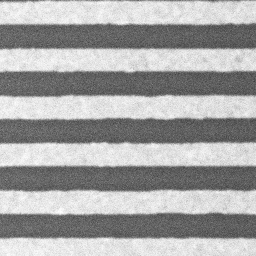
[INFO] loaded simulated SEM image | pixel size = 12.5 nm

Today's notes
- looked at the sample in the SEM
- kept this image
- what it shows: lines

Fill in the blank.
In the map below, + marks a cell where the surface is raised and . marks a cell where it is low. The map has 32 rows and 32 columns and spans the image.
++++++++++++++++++++++++++++++++
++++++++++++++++++++++++++++++++
++++++++++++++++++++++++++++++++
................................
................................
................................
++++++++++++++++++++++++++++++++
++++++++++++++++++++++++++++++++
++++++++++++++++++++++++++++++++
................................
................................
................................
++++++++++++++++++++++++++++++++
++++++++++++++++++++++++++++++++
++++++++++++++++++++++++++++++++
................................
................................
................................
++++++++++++++++++++++++++++++++
++++++++++++++++++++++++++++++++
++++++++++++++++++++++++++++++++
................................
................................
................................
++++++++++++++++++++++++++++++++
++++++++++++++++++++++++++++++++
++++++++++++++++++++...+++.+++++
................................
................................
................................
++++++++++++++++++++++++++++++++
++++++++++++++++++++++++++++++++